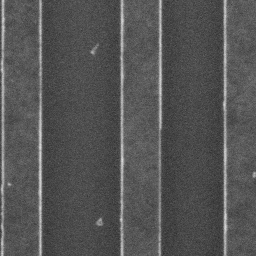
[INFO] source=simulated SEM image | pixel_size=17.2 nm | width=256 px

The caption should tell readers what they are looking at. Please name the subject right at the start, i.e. lines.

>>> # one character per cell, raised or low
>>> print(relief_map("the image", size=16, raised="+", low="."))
+++.....++....++
+++.....++....++
+++.....++....++
+++.....++....++
+++.....++....++
+++.....++....++
+++.....++....++
+++.....++....++
+++.....++....++
+++.....++....++
+++.....++....++
+++.....++....++
+++.....++....++
+++.....++....++
+++.....++....++
+++.....++....++